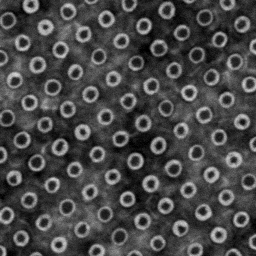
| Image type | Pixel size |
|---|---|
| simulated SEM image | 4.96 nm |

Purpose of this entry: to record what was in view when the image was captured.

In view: a regular array of raised bodies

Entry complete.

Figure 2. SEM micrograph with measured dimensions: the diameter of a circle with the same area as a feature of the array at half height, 72.5 nanometers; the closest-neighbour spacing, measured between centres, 0.132 microns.